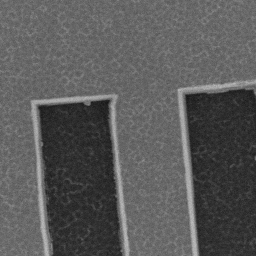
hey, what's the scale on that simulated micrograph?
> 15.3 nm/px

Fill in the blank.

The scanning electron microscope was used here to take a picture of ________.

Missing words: one or a few lines or trenches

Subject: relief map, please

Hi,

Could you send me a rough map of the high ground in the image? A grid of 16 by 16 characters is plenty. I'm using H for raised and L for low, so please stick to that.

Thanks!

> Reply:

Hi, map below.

HHHHHHHHHHHHHHHH
HHHHHHHHHHHHHHHH
HHHHHHHHHHHHHHHH
HHHHHHHHHHHHHHHH
HHHHHHHHHHHHHHHH
HHHHHHHHHHHHHLLL
HHLLLLLHHHHLLLLL
HHLLLLLHHHHLLLLL
HHLLLLLHHHHHLLLL
HHLLLLLHHHHHLLLL
HHLLLLLHHHHHLLLL
HHLLLLLHHHHHLLLL
HHHLLLLLHHHHLLLL
HHHLLLLLHHHHLLLL
HHHLLLLLHHHHLLLL
HHHLLLLLHHHHLLLL